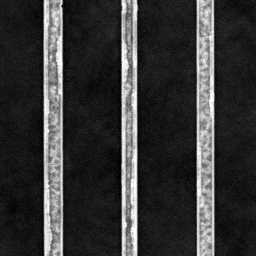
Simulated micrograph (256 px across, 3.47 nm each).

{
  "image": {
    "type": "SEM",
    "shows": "one or a few lines or trenches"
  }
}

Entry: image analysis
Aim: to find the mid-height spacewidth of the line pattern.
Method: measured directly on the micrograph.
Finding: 213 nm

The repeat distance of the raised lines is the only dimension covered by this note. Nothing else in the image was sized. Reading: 264 nanometers